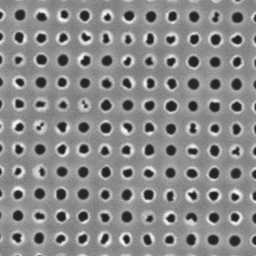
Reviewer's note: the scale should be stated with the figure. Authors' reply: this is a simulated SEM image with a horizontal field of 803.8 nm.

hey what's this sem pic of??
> a regular array of holes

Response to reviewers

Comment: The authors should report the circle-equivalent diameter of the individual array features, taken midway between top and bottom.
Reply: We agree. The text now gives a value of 28.1 nm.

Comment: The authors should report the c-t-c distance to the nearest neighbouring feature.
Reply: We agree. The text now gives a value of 0.0671 µm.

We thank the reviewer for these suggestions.